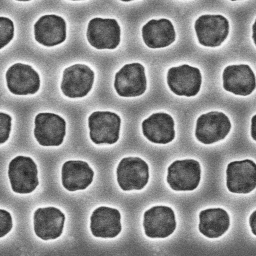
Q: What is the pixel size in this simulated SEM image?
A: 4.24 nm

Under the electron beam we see a regular array of holes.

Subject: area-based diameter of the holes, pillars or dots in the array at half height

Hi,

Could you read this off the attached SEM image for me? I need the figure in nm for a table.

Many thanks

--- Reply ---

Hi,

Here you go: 147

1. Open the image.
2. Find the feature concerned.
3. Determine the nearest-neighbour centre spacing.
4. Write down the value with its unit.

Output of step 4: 0.227 µm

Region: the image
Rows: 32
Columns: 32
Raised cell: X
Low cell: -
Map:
XXXXXXXXXXXXXXXXXXXXXXXXXXXXXXXX
XXXXXXXXXXXXXXXXXXXXXXXXXXXXXXXX
-XXXX---XXX---XXXXX--XXX----XXXX
--XX----XXX----XXX----XX-----XX-
--XX----XXX----XXX----XXX---XXX-
-XXXX--XXXX----XXX---XXXX---XXXX
XXXXXXXXXXXXXXXXXXXXXXXXXXXXXXXX
XXXXXXXXXXXXXXXXXXXXXXXXXXXXXXXX
X---XXXX---XXXX---XXX---XXXX---X
X----XXX----XX----XXX----XXX----
X----XX-----XX----XXX----XXX----
X---XXXX---XXXX---XXXX---XXXX---
XXXXXXXXXXXXXXXXXXXXXXXXXXXXXXXX
XXXXXXXXXXXXXXXXXXXXXXXXXXXXXXXX
-XXXX--XXXX----XXXX--XXXX---XXXX
-XXX----XXX----XXX----XXX----XX-
-XXX----XXX----XXX----XX-----XX-
-XXX----XXX----XXXX--XXXX---XXXX
XXXXXXXXXXXXXXXXXXXXXXXXXXXXXXXX
XX-XXXXXXXXXXXXXXXXXXXXXXXXXXXXX
X---XXXX---XXXX---XXX----XXXX---
X----XXX----XXX----XX----XXX----
X----XXX---XXXX---XXX----XXX----
X---XXXX---XXXX---XXX---XXXXX---
XXXXXXXXXXXXXXXXXXXXXXXXXXXXXXXX
XXXXXXXXXXXXXXXXXXXXXXXXXXXXXXXX
-XXX----XXXX---XXX----XXX---XXXX
-XXX----XXX----XXX----XXX----XX-
-XXX----XXX----XXX----XXX----XX-
-XXXX--XXXXX---XXX---XXXXX--XXXX
XXXXXXXXXXXXXXXXXXXXXXXXXXXXXXXX
XXXXXXXXXXXXXXXXXXXXXXXXXXXXXXXX